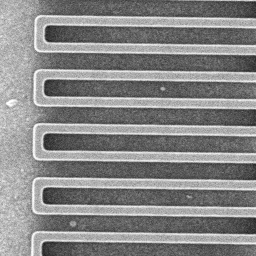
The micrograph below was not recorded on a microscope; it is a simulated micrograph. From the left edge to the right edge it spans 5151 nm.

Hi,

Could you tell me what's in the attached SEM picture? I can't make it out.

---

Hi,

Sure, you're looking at groups of lines, slits or small figures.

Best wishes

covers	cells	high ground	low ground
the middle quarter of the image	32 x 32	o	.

................................
................................
oooooooooooooooooooooooooooooooo
oooooooooooooooooooooooooooooooo
................................
................................
................................
................................
ooooooooo.......................
oooooooooooooooooooooooooooooooo
........oooooooooooooooooooooooo
................................
................................
................................
................................
ooooooooooooooooooooooooo.......
oooooooooooooooooooooooooooooooo
.........................ooooooo
................................
................................
................................
................................
oooooooooooooooooooooooooooooooo
oooooooooooooooooooooooooooooooo
................................
................................
................................
................................
................................
oooooooooooooooooooooooooooooooo
oooooooooooooooooooooooooooooooo
................................